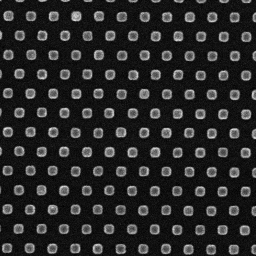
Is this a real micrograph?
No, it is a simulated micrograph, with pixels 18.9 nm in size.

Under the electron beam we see a regular array of raised bodies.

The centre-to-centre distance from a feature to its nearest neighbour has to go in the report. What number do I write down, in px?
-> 22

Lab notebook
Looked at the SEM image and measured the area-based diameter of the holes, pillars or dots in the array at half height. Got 0.188 um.